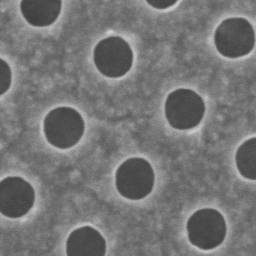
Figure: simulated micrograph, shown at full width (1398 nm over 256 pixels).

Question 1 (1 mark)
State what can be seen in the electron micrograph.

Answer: holes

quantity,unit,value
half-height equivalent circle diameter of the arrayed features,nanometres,226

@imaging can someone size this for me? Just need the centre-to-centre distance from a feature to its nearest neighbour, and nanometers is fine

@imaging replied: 471